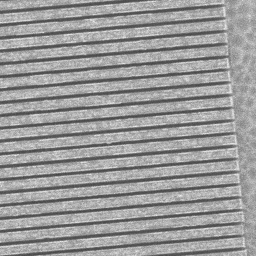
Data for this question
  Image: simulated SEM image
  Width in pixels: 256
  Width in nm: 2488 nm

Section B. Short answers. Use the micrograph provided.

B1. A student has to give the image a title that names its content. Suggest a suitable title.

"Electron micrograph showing parallel lines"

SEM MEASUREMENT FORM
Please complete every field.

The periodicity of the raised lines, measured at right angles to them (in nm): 125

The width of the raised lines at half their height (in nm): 94.4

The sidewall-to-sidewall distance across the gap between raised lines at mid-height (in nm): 33.9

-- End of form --